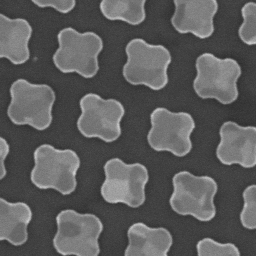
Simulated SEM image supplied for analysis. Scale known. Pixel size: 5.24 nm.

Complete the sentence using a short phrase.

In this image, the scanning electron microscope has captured a regular array of raised bodies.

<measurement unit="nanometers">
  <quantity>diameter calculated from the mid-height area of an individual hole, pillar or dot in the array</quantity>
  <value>246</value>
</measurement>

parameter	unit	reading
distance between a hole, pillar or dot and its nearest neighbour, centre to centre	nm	362